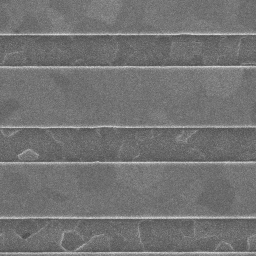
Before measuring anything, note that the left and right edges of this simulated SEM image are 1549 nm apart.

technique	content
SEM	one or a few lines or trenches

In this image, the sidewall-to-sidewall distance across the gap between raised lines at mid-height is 34.6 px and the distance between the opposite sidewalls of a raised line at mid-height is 0.35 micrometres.